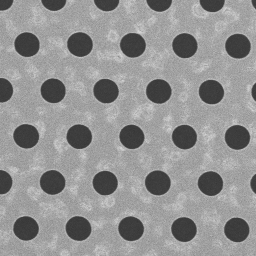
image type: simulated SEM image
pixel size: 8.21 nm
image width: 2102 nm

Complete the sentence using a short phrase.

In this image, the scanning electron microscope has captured a regular array of holes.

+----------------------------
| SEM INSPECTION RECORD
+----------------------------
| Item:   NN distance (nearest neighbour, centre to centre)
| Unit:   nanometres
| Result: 431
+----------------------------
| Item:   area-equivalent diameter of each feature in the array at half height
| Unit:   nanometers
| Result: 204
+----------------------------